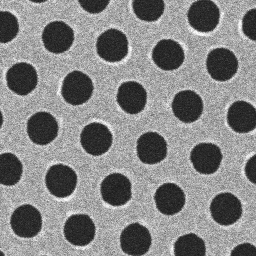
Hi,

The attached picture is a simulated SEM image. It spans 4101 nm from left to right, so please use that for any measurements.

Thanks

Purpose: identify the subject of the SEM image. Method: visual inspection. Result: a regular array of holes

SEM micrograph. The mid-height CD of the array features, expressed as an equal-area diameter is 532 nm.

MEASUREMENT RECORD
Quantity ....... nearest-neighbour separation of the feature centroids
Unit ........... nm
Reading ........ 867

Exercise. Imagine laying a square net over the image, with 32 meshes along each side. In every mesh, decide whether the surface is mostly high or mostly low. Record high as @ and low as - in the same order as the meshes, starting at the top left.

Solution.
@@@@@@@@@@----@@-----@@@---@@@@@
-@@@@@@@@@@--@@@@---@@@----@@@@-
--@@@@@@@@@@@@@@@@--@@@----@@@--
--@@@@---@@@@@@@@@@@@@@@---@@@--
--@@@----@@@----@@@@@@@@@@@@@@@-
@@@@@----@@@----@@@@--@@@@@@@@@@
@@@@@@--@@@@----@@@----@@@---@@@
@@@@@@@@@@@@@--@@@@----@@@----@@
@---@@@@@@@@@@@@@@@@--@@@@----@@
@----@@@---@@@@@@@@@@@@@@@---@@@
@----@@@----@@@---@@@@@@@@@@@@@@
@@--@@@@----@@@---@@@@--@@@@@@@@
@@@@@@@@---@@@@---@@@@---@@@@@@@
@@@@@@@@@@@@@@@---@@@----@@@@---
@@@@---@@@@@@@@@@@@@@@---@@@----
@@@----@@@@--@@@@@@@@@@@@@@@@---
@@@----@@@----@@@@-@@@@@@@@@@--@
@@@@---@@@----@@@----@@@@@@@@@@@
@@@@@@@@@@----@@@----@@@---@@@@@
--@@@@@@@@@@@@@@@----@@@----@@@@
---@@@@-@@@@@@@@@@-@@@@@----@@@-
---@@@---@@@@@@@@@@@@@@@@--@@@@-
--@@@@----@@@---@@@@@@@@@@@@@@@-
@@@@@@---@@@@---@@@@---@@@@@@@@@
@@@@@@@--@@@@---@@@----@@@@--@@@
@@@-@@@@@@@@@@--@@@----@@@----@@
@@---@@@@@@@@@@@@@@@--@@@@----@@
@----@@@----@@@@@@@@@@@@@@@---@@
@----@@@----@@@@--@@@@@@@@@@@@@@
@@--@@@@----@@@----@@@@--@@@@@@@
@@@@@@@@@--@@@@----@@@----@@@@-@
@@@@@@@@@@@@@@@---@@@@----@@@---